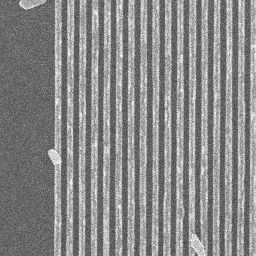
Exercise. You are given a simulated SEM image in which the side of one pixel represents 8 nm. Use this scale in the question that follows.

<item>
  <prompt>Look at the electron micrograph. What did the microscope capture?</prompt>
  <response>parallel lines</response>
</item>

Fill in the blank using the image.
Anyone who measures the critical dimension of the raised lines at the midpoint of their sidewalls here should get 0.05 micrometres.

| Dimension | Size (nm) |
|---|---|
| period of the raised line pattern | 97.8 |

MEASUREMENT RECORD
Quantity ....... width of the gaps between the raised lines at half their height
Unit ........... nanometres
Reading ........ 50